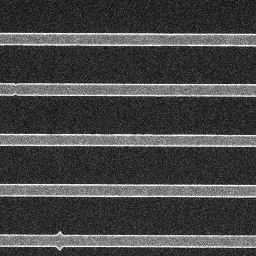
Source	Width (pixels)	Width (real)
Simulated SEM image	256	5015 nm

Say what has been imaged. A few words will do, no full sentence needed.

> parallel lines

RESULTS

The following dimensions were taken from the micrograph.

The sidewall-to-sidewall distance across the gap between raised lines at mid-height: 0.759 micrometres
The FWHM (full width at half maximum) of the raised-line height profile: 11.9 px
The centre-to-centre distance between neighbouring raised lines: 988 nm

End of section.